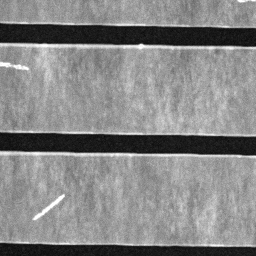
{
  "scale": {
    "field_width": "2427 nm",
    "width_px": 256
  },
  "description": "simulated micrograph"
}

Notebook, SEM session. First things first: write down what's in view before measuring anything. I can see lines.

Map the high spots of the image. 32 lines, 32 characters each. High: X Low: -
XXXXXXXXXXXXXXXXXXXXXXXXXXXXXXXX
XXXXXXXXXXXXXXXXXXXXXXXXXXXXXXXX
XXXXXXXXXXXXXXXXXXXXXXXXXXXXXXXX
--------------------------------
--------------------------------
XXXX----------------------------
XXXXXXXXXXXXXXXXXXXXXXXXXXXXXXXX
XXXXXXXXXXXXXXXXXXXXXXXXXXXXXXXX
XXXXXXXXXXXXXXXXXXXXXXXXXXXXXXXX
XXXXXXXXXXXXXXXXXXXXXXXXXXXXXXXX
XXXXXXXXXXXXXXXXXXXXXXXXXXXXXXXX
XXXXXXXXXXXXXXXXXXXXXXXXXXXXXXXX
XXXXXXXXXXXXXXXXXXXXXXXXXXXXXXXX
XXXXXXXXXXXXXXXXXXXXXXXXXXXXXXXX
XXXXXXXXXXXXXXXXXXXXXXXXXXXXXXXX
XXXXXXXXXXXXXXXXXXXXXXXXXXXXXXXX
XXXXXXXXXXXXXXXXXXXXXXXXXXXXXXXX
--------------------------------
--------------------------------
XXXXXXXXXXXXXXXXXXXXXXXXXXXXXXX-
XXXXXXXXXXXXXXXXXXXXXXXXXXXXXXXX
XXXXXXXXXXXXXXXXXXXXXXXXXXXXXXXX
XXXXXXXXXXXXXXXXXXXXXXXXXXXXXXXX
XXXXXXXXXXXXXXXXXXXXXXXXXXXXXXXX
XXXXXXXXXXXXXXXXXXXXXXXXXXXXXXXX
XXXXXXXXXXXXXXXXXXXXXXXXXXXXXXXX
XXXXXXXXXXXXXXXXXXXXXXXXXXXXXXXX
XXXXXXXXXXXXXXXXXXXXXXXXXXXXXXXX
XXXXXXXXXXXXXXXXXXXXXXXXXXXXXXXX
XXXXXXXXXXXXXXXXXXXXXXXXXXXXXXXX
-----XXXXXXXXXXXXXXXXXXXXXXXXXXX
--------------------------------